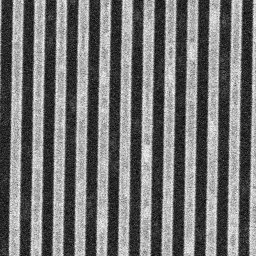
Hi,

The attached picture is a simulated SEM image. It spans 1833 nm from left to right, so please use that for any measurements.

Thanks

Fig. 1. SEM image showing parallel lines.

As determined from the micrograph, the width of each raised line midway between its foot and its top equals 64.5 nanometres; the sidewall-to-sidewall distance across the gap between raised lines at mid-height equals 89.5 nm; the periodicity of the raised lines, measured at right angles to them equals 157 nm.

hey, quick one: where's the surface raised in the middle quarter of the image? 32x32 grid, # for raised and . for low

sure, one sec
....##...##....##...##...##....#
....##...##....##...##...##....#
....##...##...##....##...##....#
....##...##...##....##...##....#
...###...##...##....##...##....#
...###...##...##....##...##....#
...###...##...##....##...##....#
...###...##...##....##...##....#
...###...##...##....##...##....#
...###...##...##....##...##....#
...###...##...##....##...##....#
...###...##...##....##...##....#
...###...##...##....##...##....#
...###...##...##....##...##....#
....##...##...##....##...##....#
....##...##...##....##...##....#
....##...##...##....##...##....#
....##...##...##....##...##....#
...##....##...##....##...##....#
...##....##...##....##...##....#
...##....##...##....##...##....#
...##....##...##....##...##....#
...##....##...##....##...##....#
...##....##...##....##...##...##
...##....##...##....##...##...##
...##....##...##....##...##...##
...##....##...##...###...##...##
...##....##...##....##...##...##
...##....##...##....##...##...##
...##....##...##....##...##...##
...##....##...##....##...##...##
...##....##...##....##...##...##